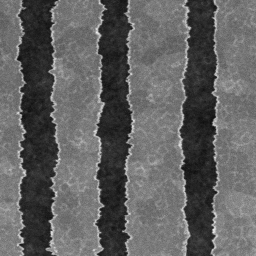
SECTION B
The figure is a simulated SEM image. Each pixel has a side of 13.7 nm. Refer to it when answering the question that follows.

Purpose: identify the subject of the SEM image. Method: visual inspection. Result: one or a few lines or trenches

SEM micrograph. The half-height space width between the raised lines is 30.3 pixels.